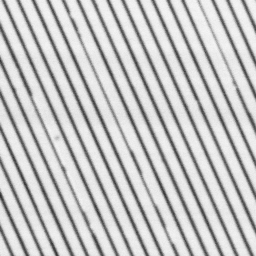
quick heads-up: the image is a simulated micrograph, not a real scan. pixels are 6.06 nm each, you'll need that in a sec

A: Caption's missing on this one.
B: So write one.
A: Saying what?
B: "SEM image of parallel lines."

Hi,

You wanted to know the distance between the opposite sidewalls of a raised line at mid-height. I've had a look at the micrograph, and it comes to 0.0643 um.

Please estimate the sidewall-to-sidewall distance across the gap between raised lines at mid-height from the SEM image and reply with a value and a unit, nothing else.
0.0166 um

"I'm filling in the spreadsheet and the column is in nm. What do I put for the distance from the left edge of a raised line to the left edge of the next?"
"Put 82.9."